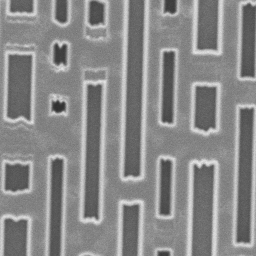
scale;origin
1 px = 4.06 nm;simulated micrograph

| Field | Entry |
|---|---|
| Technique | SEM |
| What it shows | parallel lines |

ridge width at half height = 81.1 nanometres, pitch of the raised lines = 152 nanometers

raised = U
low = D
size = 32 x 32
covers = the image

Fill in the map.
UDDDUUUDDUUDDUUUDDUUDDUUDDDDUUUD
UDDDUUUDDUUDDUUUDDUUUDUUDDDDUUDD
UUUUUUUDUUUDDUUUDDUUUUUUDDDDUUDD
UUUUUUUUUUUUUUUUDDUUUUUUDDDDUUDD
UUUUUUUUUUUUUUUUDDUUUUUUDDDUUUDD
UUUUUUUUUUUUUUUUDDUUUUUUDDDUUUDD
UUUUUUUDUUUUUUUUDDUUUDUUUUUUUUDD
UDDDUUUDUUUUUUUUDDUUDDUUUUUUUUDD
UDDDUUUUUUUUUUUUDDUUDDUUUUUUUUDD
UDDDUUUUUUUUUUUUDDUUDDUUUUUUUUDD
UDDDUUUUUUUDDUUUDDUUDDUUUUUUUUUU
UDDDUUUUUUUDDUUUDDUUDDUUDDDUUUUU
UDDDUUUUUUUDDUUDDDUUDDUUDDDUUUUU
UDDDUUUDUUUDDUUDDDUUDDUUDDDUUUDD
UDDDUUUUUUUDDUUDDDUUDDUUDDDUUUDD
UUUUUUUUUUUDDUUDDDUUUUUUDDDUUUDD
UUUUUUUUUUUDDUUDDDUUUUUUUUUUUUDD
UUUUUUUUUUUDDUUDDDUUUUUUUUUUUUDD
UUUUUUUUUUUDDUUDDDUUUUUUUUUUUUDD
UUUUUUUUUUDDDUUDDDUUUUUUUUUUUUDD
UDDUUUDDUUDDDUUDDDUUDDUUUDDUUUDD
DDDDUUDDUUDDDUUDDDUUDDUUDDDUUUDD
DDDDUUDDUUDDDUUUUUUUDDUUDDDUUUDD
UDDDUUDDUUDDDUUUUUUUDDUUDDDUUDDD
UUUUUUDDUUDDDUUUUUUUDDUUDDDUUDDD
UUUUUUDDUUDDDUUUDUUUDDUUDDDUUDDD
UUUUUUDDUUDDDUUDDDUUDUUUDDDUUDDD
UDDUUUDDUUUUUUUDDDUUUUUUDDDUUDDD
DDDDUUDDUUUUUUUDDDUUUUUUDDDUUDDD
DDDDUUDDUUUUUUUDDDUUUUUUDDDUUDDU
DDDDUUDDUUUUUUUDDDUUUUUUDDDUUUUU
DDDDUUDDUUUUUUUDDDUUDUUUDDDUUUUU